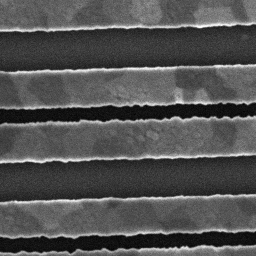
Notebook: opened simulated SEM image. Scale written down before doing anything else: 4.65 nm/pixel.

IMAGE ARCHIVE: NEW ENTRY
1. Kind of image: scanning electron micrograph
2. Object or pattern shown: lines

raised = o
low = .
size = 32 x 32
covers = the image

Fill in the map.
oooooooooooooooooooooooooooooooo
oooooooooooooooooooooooooooooooo
oooooooooooooooooooooooooooooooo
oooooooooooooo.o..o.............
................................
................................
................................
................................
...................ooooooooooooo
oooooooooooooooooooooooooooooooo
oooooooooooooooooooooooooooooooo
oooooooooooooooooooooooooooooooo
oooooooooooooooooooooooooooooooo
ooooooo.........................
................................
oooooooooooooooooooooooooooooooo
oooooooooooooooooooooooooooooooo
oooooooooooooooooooooooooooooooo
oooooooooooooooooooooooooooooooo
ooooooooooooooooooooooooooo.....
................................
................................
................................
................................
......................o...oooooo
oooooooooooooooooooooooooooooooo
oooooooooooooooooooooooooooooooo
oooooooooooooooooooooooooooooooo
oooooooooooooooooooooooooooooooo
ooooo.oooo......................
................................
......o..ooooooooooooooooooooooo